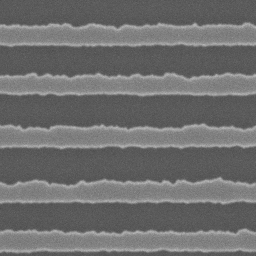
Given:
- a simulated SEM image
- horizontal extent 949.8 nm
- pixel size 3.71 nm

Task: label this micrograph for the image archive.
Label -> lines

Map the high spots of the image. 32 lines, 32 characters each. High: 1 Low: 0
00000000000000000000000000000000
00000000000000000000000000000000
00000000000000000000000000000000
11111111111111111111111111111111
11111111111111111111111111111111
11111111111111111110110111111111
00000000000000000000000000000000
00000000000000000000000000000000
00000000000000000000000000000000
00011100001110001100110000011111
11111111111111111111111111111111
11111111111111111111111111111111
00000000000000000000000000000000
00000000000000000000000000000000
00000000000000000000000000000000
00000000000000000000000000000000
11111111111111111111111111111111
11111111111111111111111111111111
00000001000000000000000000000000
00000000000000000000000000000000
00000000000000000000000000000000
00000000000000000000000000000000
00000000000000000000000000010000
11111111111111111111111111111111
11111111111111111111111111111111
00000000000000000000000000000000
00000000000000000000000000000000
00000000000000000000000000000000
00000000000000000000000000000000
11111111111111111111111111111111
11111111111111111111111111111111
00100000000000000000000000000000